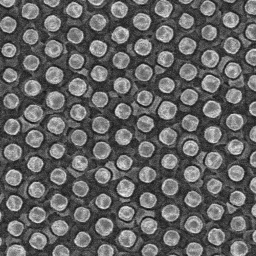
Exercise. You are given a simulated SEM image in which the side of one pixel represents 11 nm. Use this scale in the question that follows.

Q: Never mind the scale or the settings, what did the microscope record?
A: a regular array of raised bodies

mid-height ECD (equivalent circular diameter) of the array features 15.4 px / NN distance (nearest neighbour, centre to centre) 279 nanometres